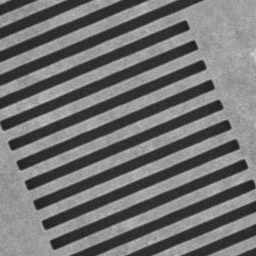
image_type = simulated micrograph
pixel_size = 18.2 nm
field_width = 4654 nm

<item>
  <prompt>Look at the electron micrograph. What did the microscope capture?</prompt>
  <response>groups of lines, slits or small figures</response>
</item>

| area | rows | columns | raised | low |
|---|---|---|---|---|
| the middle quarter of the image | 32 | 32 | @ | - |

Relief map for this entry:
@@@-------@@@@@@@-------@@@@@@@-
-------@@@@@@@-------@@@@@@@----
-----@@@@@@@-------@@@@@@@------
---@@@@@@@-------@@@@@@@-------@
@@@@@@@-------@@@@@@@-------@@@@
@@@@@-------@@@@@@@-------@@@@@@
@@-------@@@@@@@-------@@@@@@@--
-------@@@@@@@-------@@@@@@@----
-----@@@@@@@-------@@@@@@@------
--@@@@@@@-------@@@@@@@-------@@
@@@@@@@-------@@@@@@@-------@@@@
@@@@@-------@@@@@@@-------@@@@@@
@@-------@@@@@@@-------@@@@@@@--
-------@@@@@@@-------@@@@@@@----
-----@@@@@@@------@@@@@@@@------
--@@@@@@@-------@@@@@@@-------@@
@@@@@@@-------@@@@@@@-------@@@@
@@@@--------@@@@@@-------@@@@@@@
@@-------@@@@@@@-------@@@@@@---
-------@@@@@@-------@@@@@@@-----
----@@@@@@@-------@@@@@@@-------
--@@@@@@-------@@@@@@@-------@@@
@@@@@@-------@@@@@@@-------@@@@@
@@@@-------@@@@@@--------@@@@@@-
@--------@@@@@@-------@@@@@@@---
------@@@@@@@-------@@@@@@@-----
----@@@@@@--------@@@@@@-------@
-@@@@@@@-------@@@@@@@-------@@@
@@@@@@-------@@@@@@--------@@@@@
@@@-------@@@@@@@-------@@@@@@@-
@-------@@@@@@@-------@@@@@@@---
------@@@@@@-------@@@@@@@------